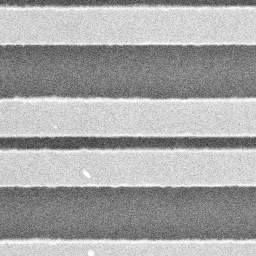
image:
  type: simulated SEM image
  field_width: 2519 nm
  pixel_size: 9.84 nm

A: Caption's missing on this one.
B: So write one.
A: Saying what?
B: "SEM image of lines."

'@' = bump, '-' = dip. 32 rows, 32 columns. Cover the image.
@@@@@@@@@@@@@@@@@@@@@@@@@@@@@@@@
@@@@@@@@@@@@@@@@@@@@@@@@@@@@@@@@
@@@@@@@@@@@@@@@@@@@@@@@@@@@@@@@@
@@@@@@@@@@@@@@@@@@@@@@@@@@@@@@@@
@@@@@@@@@@@@@@@@@@@@@@@@@@@@@@@@
@@@@@@@@@@@@@@@@@@@@@@@@@@@@@-@@
--------------------------------
--------------------------------
--------------------------------
--------------------------------
--------------------------------
--------------------------------
-@@------@-----------@---------@
@@@@@@@@@@@@@@@@@@@@@@@@@@@@@@@@
@@@@@@@@@@@@@@@@@@@@@@@@@@@@@@@@
@@@@@@@@@@@@@@@@@@@@@@@@@@@@@@@@
@@@@@@@@@@@@@@@@@@@@@@@@@@@@@@@@
@@@@@@@@@@@@@@@@@@@@@@@@@@@@@@@@
@@@@@@@@@@@@@@@@@@@@@@@@@@@@@@@@
@@@@@@@@@@@@@@@@@@@@@@@@@@@@@@@@
@@@@@@@@@@@@@@@@@@@@@@@@@@@@@@@@
@@@@@@@@@@@@@@@@@@@@@@@@@@@@@@@@
@@@@@@@@@@@@@@@@@@@@@@@@@@@@@@@@
--------------------------------
--------------------------------
--------------------------------
--------------------------------
--------------------------------
--------------------------------
--------------------------------
@@@@@@@@@@@@@@@@@@@@@@@@@@@@@@@@
@@@@@@@@@@@@@@@@@@@@@@@@@@@@@@@@